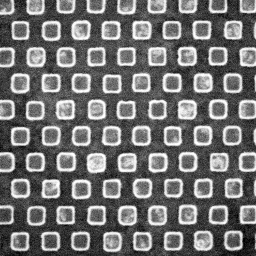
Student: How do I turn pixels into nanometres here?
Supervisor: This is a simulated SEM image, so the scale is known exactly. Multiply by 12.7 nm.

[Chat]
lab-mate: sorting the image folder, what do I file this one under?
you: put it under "a regular array of raised bodies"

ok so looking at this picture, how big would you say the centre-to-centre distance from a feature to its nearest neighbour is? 378 nm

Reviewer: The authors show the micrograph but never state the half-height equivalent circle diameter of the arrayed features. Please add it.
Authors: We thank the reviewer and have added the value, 237 nm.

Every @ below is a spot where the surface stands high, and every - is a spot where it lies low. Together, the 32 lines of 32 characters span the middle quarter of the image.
--------------------------------
--------------------------------
--------------------------------
--@@@@----@@@@---@@@@----@@@@---
--@@@@----@@@@---@@@@----@@@@---
--@@@@----@@@@---@@@@----@@@@---
---@@@----@@@@----@@@----@@@@---
--------------------------------
--------------------------------
@@-----@@@----@-@-----@@@----@@@
@@----@@@@---@@@@@---@@@@----@@@
@@----@@@@---@@@@@---@@@@----@@@
@@----@@@@----@@@@---@@@@----@@@
--------------@@@------------@@-
--------------------------------
--------------------------------
--@@@@----@@@@---@@@@----@@@@---
--@@@@----@@@@---@@@@----@@@@---
--@@@@----@@@@---@@@@----@@@@---
--@@@@----@@@@---@@@@----@@@@---
--------------------------------
--------------------------------
-@------------------------------
@@----@@@@----@@@@----@@@----@@@
@@----@@@@----@@@@----@@@----@@@
@@----@@@@----@@@@----@@@----@@@
@@----@@@@----@@@-----@@@-------
--------------------------------
--------------------------------
---@@@----@@@@----@@@----@@@@---
--@@@@----@@@@----@@@@---@@@@---
--@@@@----@@@@----@@@@---@@@@---